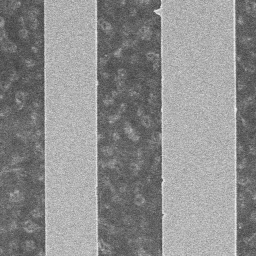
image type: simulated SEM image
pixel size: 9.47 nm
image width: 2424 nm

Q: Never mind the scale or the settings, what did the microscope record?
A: one or a few lines or trenches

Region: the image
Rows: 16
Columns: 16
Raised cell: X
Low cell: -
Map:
---XXX----XXXXX-
---XXX----XXXXX-
---XXX----XXXXX-
---XXX----XXXXX-
---XXX----XXXXX-
---XXX----XXXXX-
---XXX----XXXXX-
---XXX----XXXXX-
---XXX----XXXXX-
---XXX----XXXXX-
---XXX----XXXXX-
---XXX----XXXXX-
---XXX----XXXXX-
---XXX----XXXXX-
---XXX----XXXXX-
---XXX----XXXXX-